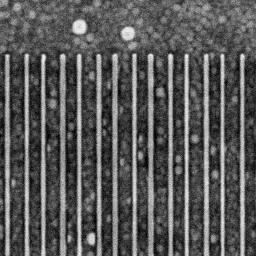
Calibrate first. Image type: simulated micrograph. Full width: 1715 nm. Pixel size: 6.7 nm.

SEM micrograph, parallel lines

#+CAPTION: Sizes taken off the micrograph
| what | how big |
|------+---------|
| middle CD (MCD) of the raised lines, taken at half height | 0.0243 micrometres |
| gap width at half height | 104 nm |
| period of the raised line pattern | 121 nm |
